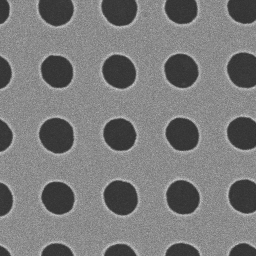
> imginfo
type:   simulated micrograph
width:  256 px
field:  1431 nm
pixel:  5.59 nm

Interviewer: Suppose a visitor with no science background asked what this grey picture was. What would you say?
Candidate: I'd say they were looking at a regular array of holes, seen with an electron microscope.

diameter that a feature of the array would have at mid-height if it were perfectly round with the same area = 188 nm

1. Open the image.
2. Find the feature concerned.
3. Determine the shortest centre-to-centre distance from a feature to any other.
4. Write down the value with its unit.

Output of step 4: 348 nanometers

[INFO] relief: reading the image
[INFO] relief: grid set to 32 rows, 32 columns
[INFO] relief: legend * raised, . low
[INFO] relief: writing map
.****....****....****....***....
.****....****....****....****...
.*****...****....****...*****...
********************************
********************************
********************************
********************************
.*****...****...*****...*****...
.****....****....****....***....
.****....****....****....****...
.*****...*****..*****...*****...
********************************
********************************
********************************
********************************
.****....****...*****...*****...
.****....****....****....***....
..***....****....****....****...
.*****...*****..******..******..
********************************
********************************
********************************
******************************.*
.*****...****....****...*****...
..***....****....****....****...
..***....****....****....****...
.*****...*****..******..******..
********************************
********************************
********************************
******..**************..******.*
.****....****....****....****...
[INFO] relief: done